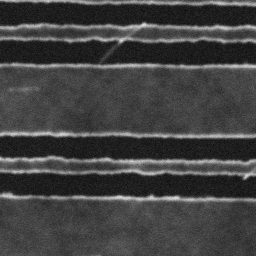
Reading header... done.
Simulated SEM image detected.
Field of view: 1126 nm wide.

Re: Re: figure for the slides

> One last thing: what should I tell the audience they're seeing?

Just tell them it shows lines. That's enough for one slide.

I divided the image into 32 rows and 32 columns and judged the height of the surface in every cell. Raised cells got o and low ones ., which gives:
.......................ooo.ooooo
................................
................................
oooooooooooooooooooooooooooooooo
oooooooooooooooooooooooooooooooo
................................
................................
................................
oooooooooooooooooooooooooooooooo
oooooooooooooooooooooooooooooooo
oooooooooooooooooooooooooooooooo
oooooooooooooooooooooooooooooooo
oooooooooooooooooooooooooooooooo
oooooooooooooooooooooooooooooooo
oooooooooooooooooooooooooooooooo
oooooooooooooooooooooooooooooooo
oooooooooooooooooooooooooooooooo
................................
................................
................................
oooooooooooooooooooooooooooooooo
.ooo..ooooooooo..ooooooooooooooo
................................
................................
o...............................
oooooooooooooooooooooooooooooooo
oooooooooooooooooooooooooooooooo
oooooooooooooooooooooooooooooooo
oooooooooooooooooooooooooooooooo
oooooooooooooooooooooooooooooooo
oooooooooooooooooooooooooooooooo
oooooooooooooooooooooooooooooooo